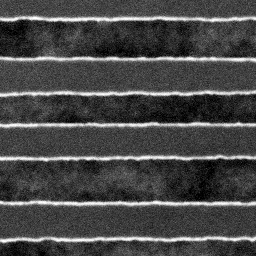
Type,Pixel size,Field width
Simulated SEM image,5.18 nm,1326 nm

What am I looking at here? lines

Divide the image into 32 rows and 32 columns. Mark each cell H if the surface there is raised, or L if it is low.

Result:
HHHHHHHHHHHHHHHHHHHHHHHHHHHHHHHH
HHHHHHHHHHHHHHHHHHHHHHHHHHHHHHHH
HHLLLHHHHHHLHHHLLLLLLLLLLHHHHLLL
LLLLLLLLLLLLLLLLLLLLLLLLLLLLLLLL
LLLLLLLLLLLLLLLLLLLLLLLLLLLLLLLL
LLLLLLLLLLLLLLLLLLLLLLLLLLLLLLLL
LLLLLLLLLLLLLLLLLLLLLLLLLLLLLLLL
HHHHHHHHHHHHHHHHHHHHHHHHHHHHHHHH
HHHHHHHHHHHHHHHHHHHHHHHHHHHHHHHH
HHHHHHHHHHHHHHHHHHHHHHHHHHHHHHHH
HHHHHHHHHHHHHHHHHHHHHHHHHHHHHHHH
HHHHHHHHHHHHHHHHHHHHHHHHHHHHHHHH
LLLLLLLLLLLLLLLLLLLLLLLLLLLLLLLL
LLLLLLLLLLLLLLLLLLLLLLLLLLLLLLLL
LLLLLLLLLLLLLLLLLLLLLLLLLLLLLLLL
LLLLLLLLLLLHLLLLLLHHLLLHHHLLLHLL
HHHHHHHHHHHHHHHHHHHHHHHHHHHHHHHH
HHHHHHHHHHHHHHHHHHHHHHHHHHHHHHHH
HHHHHHHHHHHHHHHHHHHHHHHHHHHHHHHH
HHHHHHHHHHHHHHHHHHHHHHHHHHHHHHHH
LLLLLLLLLLLLLLLLLLLLLLLLLLLLLLLL
LLLLLLLLLLLLLLLLLLLLLLLLLLLLLLLL
LLLLLLLLLLLLLLLLLLLLLLLLLLLLLLLL
LLLLLLLLLLLLLLLLLLLLLLLLLLLLLLLL
LLLLLLLLLLLLLLLLLLLLLLLLLLLLLLLL
HHHHHHHHHHHHHHHHHHHHHHHHHHHHHHHH
HHHHHHHHHHHHHHHHHHHHHHHHHHHHHHHH
HHHHHHHHHHHHHHHHHHHHHHHHHHHHHHHH
HHHHHHHHHHHHHHHHHHHHHHHHHHHHHHHH
HHHHHHHHHHHHHHHHHHHHHHHHHHHHHHHH
LLLLLLLLLLLLLLLLLLLLLLLLLLLLLLLL
LLLLLLLLLLLLLLLLLLLLLLLLLLLLLLLL